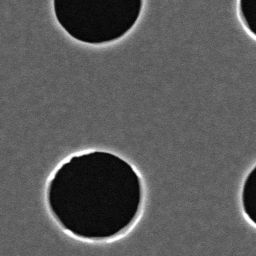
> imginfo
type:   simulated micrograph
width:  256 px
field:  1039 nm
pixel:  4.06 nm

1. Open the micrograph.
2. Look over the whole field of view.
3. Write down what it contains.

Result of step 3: holes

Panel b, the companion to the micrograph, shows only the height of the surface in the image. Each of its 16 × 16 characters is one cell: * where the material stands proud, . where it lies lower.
***......******.
****....*******.
*****..*********
****************
****************
****************
****************
****************
****************
****************
****....********
***......******.
***......******.
***.....********
****...*********
****************